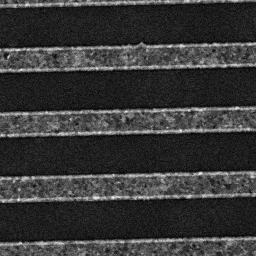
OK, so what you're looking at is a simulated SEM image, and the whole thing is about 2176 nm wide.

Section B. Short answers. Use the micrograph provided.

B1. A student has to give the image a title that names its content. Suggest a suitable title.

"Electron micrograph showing one or a few lines or trenches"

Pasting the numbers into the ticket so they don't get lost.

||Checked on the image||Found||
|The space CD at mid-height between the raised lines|376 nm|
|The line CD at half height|174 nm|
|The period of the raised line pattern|549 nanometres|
